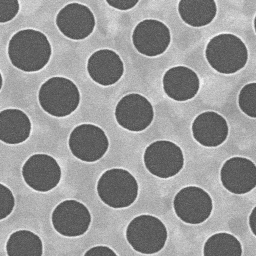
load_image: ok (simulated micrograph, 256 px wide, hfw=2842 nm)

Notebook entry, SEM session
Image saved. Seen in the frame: a regular array of holes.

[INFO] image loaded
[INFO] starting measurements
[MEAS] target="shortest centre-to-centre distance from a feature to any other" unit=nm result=605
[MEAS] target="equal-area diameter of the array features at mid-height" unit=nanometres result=432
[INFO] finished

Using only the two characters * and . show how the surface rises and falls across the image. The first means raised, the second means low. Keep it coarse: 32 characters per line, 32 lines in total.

..******..****...*****.....*****
..*****....***********.....*****
.******.....******..***....*****
*******.....*****....***********
**....**...*****.....******...**
*.....***********....*****.....*
*.....******..***...******.....*
*.....*****....***********.....*
**...******....******...***...**
***********....*****.....*******
*****....***..******.....******.
*****.....***********....*****..
*****.....*****...****..******..
*****.....****.....***********..
...****.******.....******...***.
....******.****....*****....****
....*****....***********.....***
...******.....**********....****
*********....*****....**********
****..***....*****.....*********
***....***********.....*****....
***.....*****...***...******....
***.....****.....***********....
.***...*****.....******..***....
..**********.....*****....******
..*****...***...******.....*****
.******....***********....*****.
******.....******...***...*****.
*******....*****.....**********.
*....***..******.....*****...***
*....***********.....*****....**
*....******...***...*****.....**